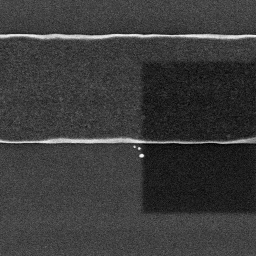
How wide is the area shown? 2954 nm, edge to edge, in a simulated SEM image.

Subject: wiring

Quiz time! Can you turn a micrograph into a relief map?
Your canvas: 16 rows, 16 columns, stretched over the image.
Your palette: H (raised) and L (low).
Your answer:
LLLLLLLLLLLLLLLL
LLLLLLLLLLLLLLLL
HHHHHHHHHHHHHHHH
HHHHHHHHHHHHHHHH
HHHHHHHHHHHHHHHH
HHHHHHHHHHHHHHHH
HHHHHHHHHHHHHHHH
HHHHHHHHHHHHHHHH
HHHHHHHHHHHHHHHH
LLLLLLLLLLLLLLLL
LLLLLLLLLLLLLLLL
LLLLLLLLLLLLLLLL
LLLLLLLLLLLLLLLL
LLLLLLLLLLLLLLLL
LLLLLLLLLLLLLLLL
LLLLLLLLLLLLLLLL